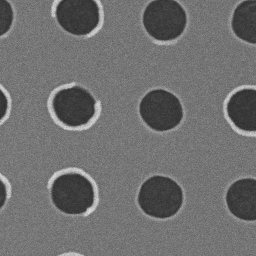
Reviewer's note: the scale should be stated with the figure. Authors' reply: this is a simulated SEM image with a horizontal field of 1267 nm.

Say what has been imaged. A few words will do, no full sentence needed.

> holes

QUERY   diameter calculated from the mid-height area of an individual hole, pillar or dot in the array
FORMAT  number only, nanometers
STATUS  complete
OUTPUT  208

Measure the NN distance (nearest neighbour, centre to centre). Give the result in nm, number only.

429